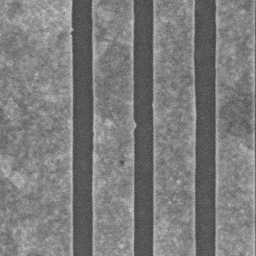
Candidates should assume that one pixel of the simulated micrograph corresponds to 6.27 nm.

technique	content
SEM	one or a few lines or trenches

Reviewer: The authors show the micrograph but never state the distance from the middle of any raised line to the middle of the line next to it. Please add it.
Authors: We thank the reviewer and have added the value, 384 nanometers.